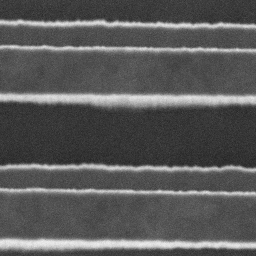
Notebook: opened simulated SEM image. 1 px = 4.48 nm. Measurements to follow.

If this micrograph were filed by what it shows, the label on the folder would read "lines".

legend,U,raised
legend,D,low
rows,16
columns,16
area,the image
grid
DDDDDDDDDDDDDDDD
UUUUUUUUDDDDDDDD
UUUUUUUUUUUUUUUU
UUUUUUUUUUUUUUUU
UUUUUUUUUUUUUUUU
UUUUUUUUUUUUUUUU
DDDDDDDDDDDDDDDD
DDDDDDDDDDDDDDDD
DDDDDDDDDDDDDDDD
DDDDDDDDDDDDDDDD
UUUUUUUDDDDDDDUD
UUUUUUUUUUUUUUUU
UUUUUUUUUUUUUUUU
UUUUUUUUUUUUUUUU
UUUUUUUUUUUUUUUU
DDDDDDDDDDDDDDDD